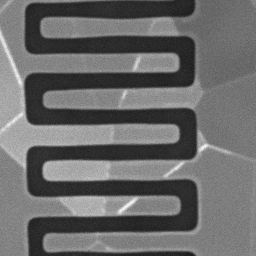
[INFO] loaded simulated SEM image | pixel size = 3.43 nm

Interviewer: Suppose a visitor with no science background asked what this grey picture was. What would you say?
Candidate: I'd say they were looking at groups of lines, slits or small figures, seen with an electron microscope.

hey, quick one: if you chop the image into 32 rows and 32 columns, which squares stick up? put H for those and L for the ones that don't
HHHHLLLLLLLLLLLLLLLLLLLLHHHHHHHH
HHHLLLLLLLLLLLLLLLLLLLLLHHHHHHHH
HHHLLHHHHHHHHHHHHHHHHHHHHHHHHHHH
HHHLLHHHHHHHHHHHHHHHHHHHHHHHHHHH
HHHLLHHHHHHHLLLLLLLLLLLHHHHHHHHH
HHHLLLLLLLLLLLLLLLLLLLLLHHHHHHHH
HHHLLLLLLLLLLLLLLLLLLLLLHHHHHHHH
HHHHHHHHHHHHHHHHHHHHHHLLHHHHHHHH
HHHHHHHHHHHHHHHHHHHHHHLLHHHHHHHH
HHHLLLLLLLLLLLLLLLLLLLLLHHHHHHHH
HHHLLLLLLLLLLLLLLLLLLLLLHHHHHHHH
HHHLLLHHHHHHHHHHHHHHHHHHHHHHHHHH
HHHLLHHHHHHHHHHHHHHHHHHHHHHHHHHH
HHHLLLLLLLHHHHHHHHLLLLLLHHHHHHHH
HHHLLLLLLLLLLLLLLLLLLLLLLHHHHHHH
HHHHLLLLLLLLLLLLLLLLLLLLLHHHHHHH
HHHHHHHHHHHHHHHHHHHHHHLLLHHHHHHH
HHHHHHHHHHHHHHHHHHHHHHLLLHHHHHHH
HHHHLLLLLLLLLLLLLLLLLLLLLHHHHHHH
HHHLLLLLLLLLLLLLLLLLLLLLHHHHHHHH
HHHLLLHHHHHHHHHHHHHHHHHHHHHHHHHH
HHHLLHHHHHHHHHHHHHHHHHHHHHHHHHHH
HHHLLLHHHHHHLLLLLLLLLLLLHHHHHHHH
HHHLLLLLLLLLLLLLLLLLLLLLLHHHHHHH
HHHHLLLLLLLLLLLLLLLLLLLLLHHHHHHH
HHHHHHHHHHHHHHHHHHHHHHLLLHHHHHHH
HHHHHHHHHHHHHHHHHHHHHHLLLHHHHHHH
HHHHLLLLLLLLLLLLLLLLLLLLLHHHHHHH
HHHLLLLLLLLLLLLLLLLLLLLLHHHHHHHH
HHHLLLHHHHHHHHHHHHHHHHHHHHHHHHHH
HHHLLHHHHHHHHHHHHHHHHHHHHHHHHHHH
HHHLLLLLLLLLLLLLLLLLLLLLHHHHHHHH